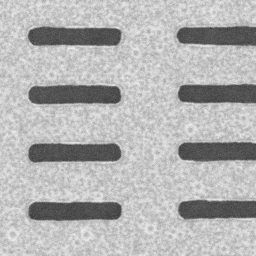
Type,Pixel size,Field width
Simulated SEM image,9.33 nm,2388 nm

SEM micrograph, holes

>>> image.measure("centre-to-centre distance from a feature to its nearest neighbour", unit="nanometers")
542